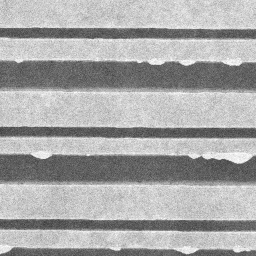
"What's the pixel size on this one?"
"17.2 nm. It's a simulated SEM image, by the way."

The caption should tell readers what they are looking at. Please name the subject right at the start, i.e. lines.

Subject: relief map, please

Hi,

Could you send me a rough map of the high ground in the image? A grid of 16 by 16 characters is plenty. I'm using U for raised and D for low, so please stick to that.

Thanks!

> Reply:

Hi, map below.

UUUUUUUUUUUUUUUU
UUUUUUUUUUUUUUUU
UUUUUUUUUUUUUUUU
UUUUUUUUUUUUUUUU
DDDDDDDDDDDDDDDD
DDDDDDDDDDDDDDDD
UUUUUUUUUUUUUUUU
UUUUUUUUUUUUUUUU
UUUUUUUUUUUUUUUU
UUUUUUUUUUUUUUUU
DDDDDDDDDDDDDDDD
DDDDDDDDDDDDDDDD
UUUUUUUUUUUUUUUU
UUUUUUUUUUUUUUUU
UUUUUUUUUUUUUUUU
UDDDDDUUDUUUUUUU